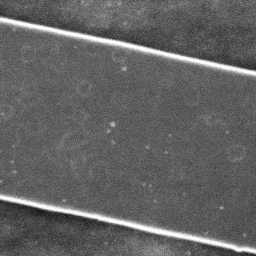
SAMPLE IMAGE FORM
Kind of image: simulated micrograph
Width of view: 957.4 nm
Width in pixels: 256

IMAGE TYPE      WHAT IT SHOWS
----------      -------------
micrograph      one or a few lines or trenches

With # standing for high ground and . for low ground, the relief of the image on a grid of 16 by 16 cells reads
................
##..............
######..........
###########.....
###############.
################
################
################
################
################
################
################
.###############
......##########
..........######
...............#